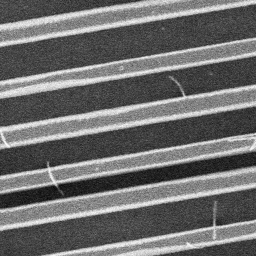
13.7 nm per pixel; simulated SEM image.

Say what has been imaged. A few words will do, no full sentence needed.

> lines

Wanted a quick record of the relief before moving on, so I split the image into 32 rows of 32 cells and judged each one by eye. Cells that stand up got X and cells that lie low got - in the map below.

----------------XXXXXXXXXXXXXXX-
----------XXXXXXXXXXXXXXX-------
----XXXXXXXXXXXXXXX-------------
XXXXXXXXXXXXX-------------------
XXXXXXXX------------------------
XX--------------------------XXXX
----------------------XXXXXXXXXX
---------------XXXXXXXXXXXXX----
----------XXXXXXXXXXXX----------
----XXXXXXXXXXXX----------------
XXXXXXXXXX----------------------
XXXX-----------------------XXXXX
--------------------XXXXXXXXXXXX
---------------XXXXXXXXXXXXXXX--
---------XXXXXXXXXXXXXXX--------
---XXXXXXXXXXXXXXX--------------
XXXXXXXXXXXX--------------------
XXXXXX---------------------XXXXX
---------------------XXXXXXXXXXX
---------------XXXXXXXXXXXX-----
---------XXXXXXXXXXXXX----------
---XXXXXXXXXXXXX------------XXXX
XXXXXXXXXX------------XXXXXXXXXX
XXXX------------XXXXXXXXXXXXXXX-
----------XXXXXXXXXXXXXXX-------
----XXXXXXXXXXXXXXX-------------
XXXXXXXXXXXXXX------------------
XXXXXXXX------------------------
X------------------------XXXXXXX
--------------------XXXXXXXXXXXX
--------------XXXXXXXXXXXXX-----
--------XXXXXXXXXXXXX-----------